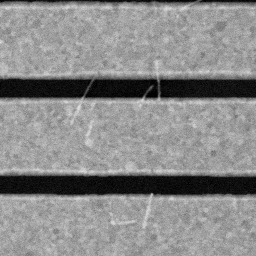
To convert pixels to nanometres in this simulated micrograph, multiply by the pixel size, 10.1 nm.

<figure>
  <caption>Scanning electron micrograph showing lines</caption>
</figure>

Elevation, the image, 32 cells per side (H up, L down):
LLLLLLLLLLLLLLLLLLLLLLLLHLLLLLLL
HHHHHHHHHHHHHHHHHHHHHHHHHHHHHHHH
HHHHHHHHHHHHHHHHHHHHHHHHHHHHHHHH
HHHHHHHHHHHHHHHHHHHHHHHHHHHHHHHH
HHHHHHHHHHHHHHHHHHHHHHHHHHHHHHHH
HHHHHHHHHHHHHHHHHHHHHHHHHHHHHHHH
HHHHHHHHHHHHHHHHHHHHHHHHHHHHHHHH
HHHHHHHHHHHHHHHHHHHHHHHHHHHHHHHH
HHHHHHHHHHHHHHHHHHHHHHHHHHHHHHHH
HHHHHHHHHHHHHHHHHHHHHHHHHHLLHHHH
LLLLLLLLLLLLLLLLLLLLLLLLLLLLLLLL
LLLLLLLLLLLLLLLLLLLLLLLLLLLLLLLL
HHHHHHHHHHHHHHHHHHHHHHHHHHHHHHHH
HHHHHHHHHHHHHHHHHHHHHHHHHHHHHHHH
HHHHHHHHHHHHHHHHHHHHHHHHHHHHHHHH
HHHHHHHHHHHHHHHHHHHHHHHHHHHHHHHH
HHHHHHHHHHHHHHHHHHHHHHHHHHHHHHHH
HHHHHHHHHHHHHHHHHHHHHHHHHHHHHHHH
HHHHHHHHHHHHHHHHHHHHHHHHHHHHHHHH
HHHHHHHHHHHHHHHHHHHHHHHHHHHHHHHH
HHHHHHHHHHHHHHHHHHHHHHHHHHHHHHHH
HHHHHHHHHHHHHHHHHHHHHHHHHHHHHHHH
LLLLLLLLLLLLLLLLLLLLLLLLLLLLLLLL
LLLLLLLLLLLLLLLLLLLLLLLLLLLLLLLL
LLLLLLLLLLLLLLHHLLHHLLLLLLLLLLLL
HHHHHHHHHHHHHHHHHHHHHHHHHHHHHHHH
HHHHHHHHHHHHHHHHHHHHHHHHHHHHHHHH
HHHHHHHHHHHHHHHHHHHHHHHHHHHHHHHH
HHHHHHHHHHHHHHHHHHHHHHHHHHHHHHHH
HHHHHHHHHHHHHHHHHHHHHHHHHHHHHHHH
HHHHHHHHHHHHHHHHHHHHHHHHHHHHHHHH
HHHHHHHHHHHHHHHHHHHHHHHHHHHHHHHH